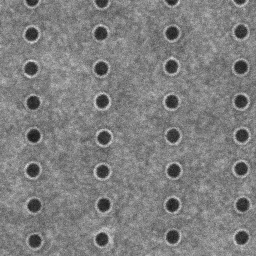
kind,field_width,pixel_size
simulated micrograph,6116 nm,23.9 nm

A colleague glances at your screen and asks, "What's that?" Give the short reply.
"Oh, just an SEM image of a regular array of raised bodies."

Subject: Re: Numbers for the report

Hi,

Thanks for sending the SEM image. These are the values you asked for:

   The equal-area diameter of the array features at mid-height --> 391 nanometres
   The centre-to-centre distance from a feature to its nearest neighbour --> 802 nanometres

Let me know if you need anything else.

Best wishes